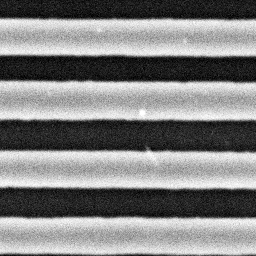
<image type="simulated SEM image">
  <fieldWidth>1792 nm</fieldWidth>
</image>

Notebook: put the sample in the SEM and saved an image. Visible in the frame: lines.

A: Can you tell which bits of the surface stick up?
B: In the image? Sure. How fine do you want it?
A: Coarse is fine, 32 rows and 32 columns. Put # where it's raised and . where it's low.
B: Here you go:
................................
................................
#####.#.......##...###..........
################################
################################
################################
################################
................................
................................
................................
################################
################################
################################
################################
################################
................................
................................
................................
................................
################################
################################
################################
################################
.....................##.##.....#
................................
................................
................................
################################
################################
################################
################################
################################